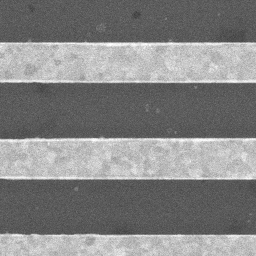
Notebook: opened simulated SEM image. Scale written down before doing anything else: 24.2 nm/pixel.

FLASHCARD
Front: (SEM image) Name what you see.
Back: lines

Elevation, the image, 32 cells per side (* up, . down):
................................
................................
................................
................................
................................
********************************
********************************
********************************
********************************
********************************
................................
................................
................................
................................
................................
................................
................................
********************************
********************************
********************************
********************************
********************************
................................
................................
................................
................................
................................
................................
................................
********************************
********************************
********************************